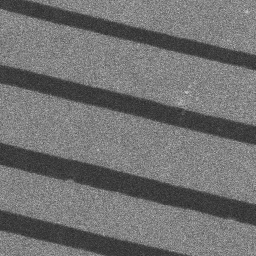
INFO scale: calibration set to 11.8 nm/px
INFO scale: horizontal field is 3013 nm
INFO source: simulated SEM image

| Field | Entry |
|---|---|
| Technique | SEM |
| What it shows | one or a few lines or trenches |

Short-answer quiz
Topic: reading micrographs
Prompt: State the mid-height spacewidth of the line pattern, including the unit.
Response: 603 nm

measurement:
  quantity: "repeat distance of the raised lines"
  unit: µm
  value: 0.856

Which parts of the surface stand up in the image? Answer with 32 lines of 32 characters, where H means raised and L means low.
HHHHHHLLLLLLLLLLLLLLLLLLLLLLLLLL
LHHHHHHHHHLLLLLLLLLLLLLLLLLLLLLL
LLLLLHHHHHHHHHLLLLLLLLLLLLLLLLLL
LLLLLLLLLHHHHHHHHHLLLLLLLLLLLLLL
LLLLLLLLLLLLLHHHHHHHHHLLLLLLLLLL
LLLLLLLLLLLLLLLLLHHHHHHHHHHLLLLL
LLLLLLLLLLLLLLLLLLLLLHHHHHHHHHHL
LLLLLLLLLLLLLLLLLLLLLLLLLLHHHHHH
HHLLLLLLLLLLLLLLLLLLLLLLLLLLLLHH
HHHHHHHLLLLLLLLLLLLLLLLLLLLLLLLL
HHHHHHHHHHHLLLLLLLLLLLLLLLLLLLLL
LLLLHHHHHHHHHHHLLLLLLLLLLLLLLLLL
LLLLLLLLHHHHHHHHHHHLLLLLLLLLLLLL
LLLLLLLLLLLLHHHHHHHHHHHLLLLLLLLL
LLLLLLLLLLLLLLLLHHHHHHHHHHHLLLLL
LLLLLLLLLLLLLLLLLLLLHHHHHHHHHHHH
LLLLLLLLLLLLLLLLLLLLLLLLLHHHHHHH
LLLLLLLLLLLLLLLLLLLLLLLLLLLLHHHH
HHHLLLLLLLLLLLLLLLLLLLLLLLLLLLLL
HHHHHHHHLLLLLLLLLLLLLLLLLLLLLLLL
HHHHHHHHHHHHLLLLLLLLLLLLLLLLLLLL
LLLHHHHHHHHHHHHHLLLLLLLLLLLLLLLL
LLLLLLLHHHHHHHHHHHHHLLLLLLLLLLLL
LLLLLLLLLLLLHHHHHHHHHHHHLLLLLLLL
LLLLLLLLLLLLLLLHHHHHHHHHHHHHLLLL
LLLLLLLLLLLLLLLLLLLLHHHHHHHHHHHH
HHLLLLLLLLLLLLLLLLLLLLLLHHHHHHHH
HHHHHHLLLLLLLLLLLLLLLLLLLLLLLHHH
HHHHHHHHHHLLLLLLLLLLLLLLLLLLLLLL
LLHHHHHHHHHHHHLLLLLLLLLLLLLLLLLL
LLLLLLLHHHHHHHHHHHLLLLLLLLLLLLLL
LLLLLLLLLLLHHHHHHHHHHHLLLLLLLLLL